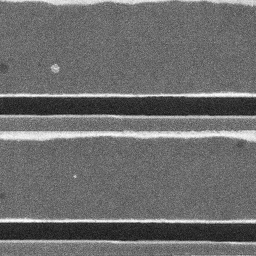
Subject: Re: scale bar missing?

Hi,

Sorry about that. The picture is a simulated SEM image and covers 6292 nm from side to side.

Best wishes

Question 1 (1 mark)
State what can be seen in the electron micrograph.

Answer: lines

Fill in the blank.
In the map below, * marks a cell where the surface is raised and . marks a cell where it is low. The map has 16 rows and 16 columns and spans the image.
****************
****************
****************
****************
****************
****************
................
................
****************
****************
****************
****************
****************
****************
................
................